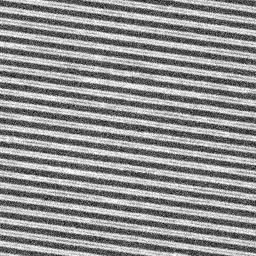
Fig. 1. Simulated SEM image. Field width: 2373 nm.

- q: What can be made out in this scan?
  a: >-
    parallel lines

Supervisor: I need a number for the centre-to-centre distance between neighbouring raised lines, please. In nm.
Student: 108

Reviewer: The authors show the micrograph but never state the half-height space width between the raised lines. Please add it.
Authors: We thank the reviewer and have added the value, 0.078 micrometres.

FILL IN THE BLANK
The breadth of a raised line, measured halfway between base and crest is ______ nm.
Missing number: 26.3